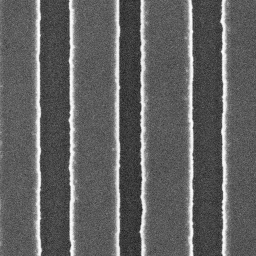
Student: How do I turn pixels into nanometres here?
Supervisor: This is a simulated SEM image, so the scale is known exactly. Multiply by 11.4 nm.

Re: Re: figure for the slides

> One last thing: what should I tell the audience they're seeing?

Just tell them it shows lines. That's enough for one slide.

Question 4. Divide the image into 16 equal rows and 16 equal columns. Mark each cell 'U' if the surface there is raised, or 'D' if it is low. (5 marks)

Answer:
UUDDUUUDDUUUDDUU
UUDDUUUDDUUUDDUU
UUDDUUUDDUUUDDUU
UUDDUUUDDUUUDDUU
UUDDUUUDDUUUDDUU
UUDDUUUDDUUUDDUU
UUDDUUUDDUUUDDUU
UUDDUUUDDUUUDDUU
UUDDUUUDDUUUDDUU
UUDDUUUDDUUUDDUU
UUDDUUUDDUUUDDUU
UUUDUUUDDUUUDDUU
UUDDUUUDDUUUDDUU
UUDDUUUDDUUUDDUU
UUDDUUUDDUUUDDUU
UUUDUUUDDUUUDDUU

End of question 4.